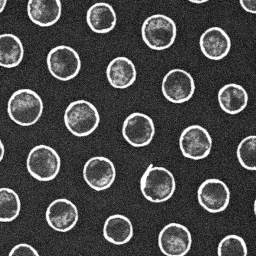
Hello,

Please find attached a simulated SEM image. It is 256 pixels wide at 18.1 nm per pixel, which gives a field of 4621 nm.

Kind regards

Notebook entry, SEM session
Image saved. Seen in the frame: a regular array of raised bodies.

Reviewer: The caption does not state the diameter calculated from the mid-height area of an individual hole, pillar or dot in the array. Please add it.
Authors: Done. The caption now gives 561 nm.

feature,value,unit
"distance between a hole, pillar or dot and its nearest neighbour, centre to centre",1020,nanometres